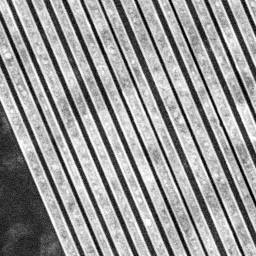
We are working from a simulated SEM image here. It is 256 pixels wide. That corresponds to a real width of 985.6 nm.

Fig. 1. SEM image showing parallel lines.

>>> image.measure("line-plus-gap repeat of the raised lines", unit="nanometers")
63.3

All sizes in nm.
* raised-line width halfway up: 40.3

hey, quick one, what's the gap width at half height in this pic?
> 0.0235 microns